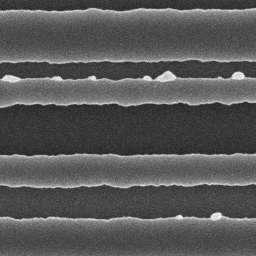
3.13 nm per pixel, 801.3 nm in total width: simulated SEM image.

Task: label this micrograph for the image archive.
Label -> lines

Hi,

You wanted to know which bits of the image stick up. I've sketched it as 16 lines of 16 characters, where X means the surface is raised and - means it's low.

----------------
XXXXXXXXXXXXXXXX
XXXXXXXXXXXXXXXX
XXXXXXXXXXXXXXXX
XXXXXXXXXXXXXXXX
XXXXXXXXXXXXXXXX
XXXXX-XXX---X---
----------------
----------------
----------------
XXXXXXXXXXXXXXXX
XXXXXXXXXXXXXXXX
XXXXXXXXXXXXXXXX
XXXXXXXXXXXXXXXX
XXXXXXXXXXXXXXXX
XXXXXXXXXXXXXXXX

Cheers